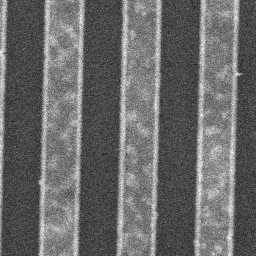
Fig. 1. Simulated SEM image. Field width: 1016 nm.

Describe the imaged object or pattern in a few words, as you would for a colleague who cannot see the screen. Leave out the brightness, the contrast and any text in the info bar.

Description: one or a few lines or trenches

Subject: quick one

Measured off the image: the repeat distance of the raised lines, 308 nanometers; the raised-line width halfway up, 0.141 micrometres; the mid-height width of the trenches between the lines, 164 nanometres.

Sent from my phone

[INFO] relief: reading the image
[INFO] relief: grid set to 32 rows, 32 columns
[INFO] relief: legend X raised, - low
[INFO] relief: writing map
X-----XXXX------XXXX-----XXXXX--
X-----XXXX------XXXX-----XXXXX--
X-----XXXX------XXXX-----XXXXX--
X-----XXXX------XXXX-----XXXXX--
------XXXX-----XXXXX-----XXXXX--
------XXXX-----XXXXX-----XXXXX--
------XXXX-----XXXXX-----XXXXX--
X-----XXXX-----XXXXX-----XXXX---
X-----XXXX-----XXXXX-----XXXX---
------XXXX-----XXXXX-----XXXXX--
------XXXX-----XXXXX-----XXXX---
------XXXX-----XXXXX-----XXXX---
------XXXX-----XXXXX-----XXXX---
------XXXX-----XXXXX-----XXXX---
------XXXX-----XXXXX-----XXXX---
-----XXXXX-----XXXXX-----XXXX---
-----XXXXX-----XXXXX-----XXXX---
-----XXXXX-----XXXXX-----XXXX---
-----XXXXX-----XXXXX-----XXXX---
-----XXXXX-----XXXXX-----XXXX---
-----XXXXX-----XXXX------XXXX---
-----XXXXX-----XXXX------XXXX---
-----XXXXX-----XXXX------XXXX---
-----XXXXX-----XXXX------XXXX---
-----XXXXX-----XXXX------XXXX---
-----XXXXX-----XXXX------XXXX---
-----XXXXX-----XXXX------XXXX---
-----XXXXX-----XXXX------XXXX---
-----XXXXX-----XXXX------XXXX---
-----XXXXX-----XXXX-----XXXXX---
-----XXXXX-----XXXX-----XXXXX---
-----XXXXX-----XXXX------XXXX---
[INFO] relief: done